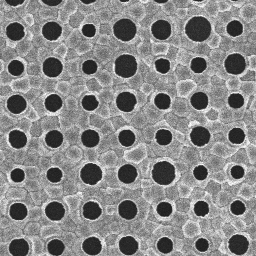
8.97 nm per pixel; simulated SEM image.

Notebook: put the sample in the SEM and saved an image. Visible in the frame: a regular array of holes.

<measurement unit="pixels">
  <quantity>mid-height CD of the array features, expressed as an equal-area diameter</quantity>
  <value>17.8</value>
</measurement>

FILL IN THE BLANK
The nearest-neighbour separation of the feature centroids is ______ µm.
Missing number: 0.321